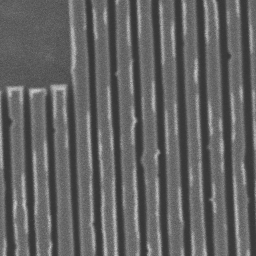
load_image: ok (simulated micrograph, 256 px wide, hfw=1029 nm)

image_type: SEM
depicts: parallel lines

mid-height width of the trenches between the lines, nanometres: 27.1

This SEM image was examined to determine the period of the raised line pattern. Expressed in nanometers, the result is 88.9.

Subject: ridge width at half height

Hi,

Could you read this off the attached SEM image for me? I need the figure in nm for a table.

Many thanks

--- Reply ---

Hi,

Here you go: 62.2